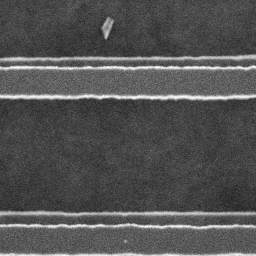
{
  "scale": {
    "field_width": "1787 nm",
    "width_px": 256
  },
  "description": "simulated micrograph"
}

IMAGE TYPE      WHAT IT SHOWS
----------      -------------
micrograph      lines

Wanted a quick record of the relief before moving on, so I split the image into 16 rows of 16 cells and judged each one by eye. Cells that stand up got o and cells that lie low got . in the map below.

................
................
................
................
oooooooooooooooo
oooooooooooooooo
................
................
................
................
................
................
................
oooooooooooooooo
oooooooooooooooo
oooooooooooooooo